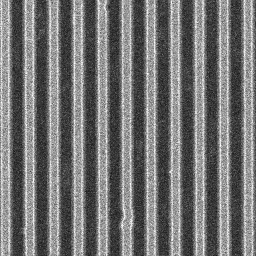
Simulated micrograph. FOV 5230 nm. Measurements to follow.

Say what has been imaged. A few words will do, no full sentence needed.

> parallel lines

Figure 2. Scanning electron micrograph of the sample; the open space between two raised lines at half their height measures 288 nm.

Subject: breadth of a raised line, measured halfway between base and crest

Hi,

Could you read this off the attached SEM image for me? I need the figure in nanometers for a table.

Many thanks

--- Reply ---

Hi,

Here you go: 214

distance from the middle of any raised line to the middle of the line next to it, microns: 0.496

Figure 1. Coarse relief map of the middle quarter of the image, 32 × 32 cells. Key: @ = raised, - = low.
--@@@---@@@---@@@----@@----@@---
--@@@----@@---@@@----@@----@@---
--@@@----@@---@@@---@@@----@@---
--@@@----@@---@@@---@@@----@@---
--@@@---@@@----@@----@@----@@---
--@@@---@@@----@@---@@@----@@---
--@@@----@@----@@---@@@----@@---
--@@@----@@----@@---@@@----@@---
--@@@---@@@----@@---@@@----@@---
--@@@----@@----@@----@@----@@---
--@@@----@@----@@---@@@----@@---
--@@@----@@----@@---@@@----@@---
--@@@----@@----@@----@@----@@---
--@@@---@@@----@@----@@----@@---
--@@@---@@@----@@----@@----@@---
--@@@---@@@----@@----@@----@@---
--@@@---@@@----@@---@@@----@@---
--@@@---@@@----@@---@@@----@@---
--@@@---@@@----@@----@@----@@---
--@@@----@@----@@----@@----@@---
--@@@---@@@----@@----@@----@@---
--@@@---@@@----@@----@@----@@---
--@@@---@@@----@@----@@----@@---
--@@@---@@@----@@----@@----@@---
--@@@---@@@----@@----@@----@@---
--@@@---@@@----@@---@@@----@@---
--@@@---@@@----@@---@@@---@@@---
--@@@---@@@----@@---@@@---@@@---
--@@@---@@@----@@----@@----@@---
--@@@---@@@----@@----@@----@@---
--@@@---@@@----@@----@@----@@---
--@@@---@@@----@@----@@----@@---